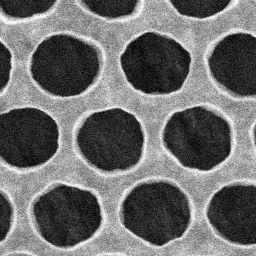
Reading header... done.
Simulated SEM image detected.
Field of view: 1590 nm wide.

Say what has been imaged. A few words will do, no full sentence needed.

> holes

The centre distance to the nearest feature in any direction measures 85.5 px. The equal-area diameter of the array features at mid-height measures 408 nanometers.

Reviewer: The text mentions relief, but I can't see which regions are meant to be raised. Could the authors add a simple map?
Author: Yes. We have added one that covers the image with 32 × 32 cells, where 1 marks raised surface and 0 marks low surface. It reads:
00000001110000000111110000000111
00000011111000000111110000011111
11111111111111111111111111111111
11111111111111111111111111111111
11111100011111111000011111110000
11111000000011110000001111100000
01110000000001100000000111100000
01110000000001100000000011000000
01110000000001100000000011000000
01110000000011110000000111000000
01111000000111110000000111100000
11111100001111111100001111110000
11111111111111111111111111111111
11101111111111111111111100111111
00000011111000000111110000001111
00000001110000000111100000000111
00000001110000000011000000000111
00000001110000000011000000000111
00000001110000000011100000000111
00000001110000000011110000000111
10000111111000000111111000011111
11111111111111111111111111111111
11111111111111111111111111111111
11111100001111111000001111110000
01111000000011110000000111100000
00110000000011100000000011000000
00110000000011100000000011000000
00110000000001100000000011000000
01110000000011110000000111100000
01111000000111111000000111100000
11111100001111111110011111111101
11111111111111111111111111111111